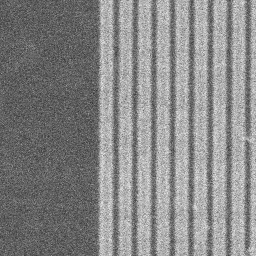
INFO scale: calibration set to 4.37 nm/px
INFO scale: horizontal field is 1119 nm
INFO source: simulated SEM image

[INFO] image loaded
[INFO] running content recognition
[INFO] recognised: parallel lines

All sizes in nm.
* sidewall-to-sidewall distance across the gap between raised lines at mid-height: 31.1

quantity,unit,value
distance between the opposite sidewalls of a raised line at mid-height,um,0.0502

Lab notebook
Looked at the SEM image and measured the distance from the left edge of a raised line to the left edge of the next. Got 82.4 nm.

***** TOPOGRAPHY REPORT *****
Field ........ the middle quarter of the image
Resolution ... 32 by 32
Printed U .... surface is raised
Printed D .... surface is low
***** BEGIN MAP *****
DDDDDDDDDUUUDDUUUDDUUUDDUUDDUUUD
DDDDDDDDDUUUDDUUUDDUUDDDUUDDUUUD
DDDDDDDDDUUUDDUUUDDUUUDDUUDDUUUD
DDDDDDDDDUUUDDUUUDDUUUDDUUDDUUUD
DDDDDDDDDUUUDDUUUDDUUUDDUUDDUUUD
DDDDDDDDDUUUDDUUUDDUUUDDUUDDUUUD
DDDDDDDDDUUUDDUUUDDUUDDDUUDDUUUD
DDDDDDDDDUUUDDUUUDDUUDDDUUDDUUUD
DDDDDDDDDUUUDDUUUDDUUDDDUUDDUUUD
DDDDDDDDDUUUDDUUUDDUUDDDUUDDUUUD
DDDDDDDDDUUUDDUUUDDUUDDDUUDDUUUD
DDDDDDDDDUUUDDUUUDDUUDDDUUDDUUUD
DDDDDDDDDUUUDDUUUDDUUDDDUUDDUUUD
DDDDDDDDDUUUDDUUUDDUUDDDUUDDUUUD
DDDDDDDDDUUUDDUUUDDUUDDDUUDDUUUD
DDDDDDDDDUUUDDUUUDDUUDDDUUDDUUUD
DDDDDDDDDUUUDDUUUDDUUDDDUUDDUUUD
DDDDDDDDDUUUDDUUUDDUUDDUUUDDUUUD
DDDDDDDDDUUUDDUUUDDUUDDUUUDDUUUD
DDDDDDDDDUUUDDUUUDDUUDDUUUDDUUUD
DDDDDDDDDUUUDDUUUDDUUDDUUUDDUUUD
DDDDDDDDDUUUDDUUUDDUUDDUUUDDUUUD
DDDDDDDDDUUUDDUUUDDUUDDUUUDDUUUD
DDDDDDDDDUUUDDUUUDDUUDDUUUDDUUUD
DDDDDDDDDUUUDDUUUDDUUDDUUUDDUUUD
DDDDDDDDDUUUDDUUUDDUUDDUUUDDUUUD
DDDDDDDDDUUUDDUUUDDUUDDUUUDDUUUD
DDDDDDDDDUUUDDUUUDDUUDDUUUDDUUUD
DDDDDDDDDUUUDDUUUDDUUDDUUUDDUUUD
DDDDDDDDDUUUDDUUUDDUUDDUUUDDUUUD
DDDDDDDDDUUUDDUUUDDUUDDUUUDDUUUD
DDDDDDDDDUUUDDUUUDDUUDDUUUDDUUUD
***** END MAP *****